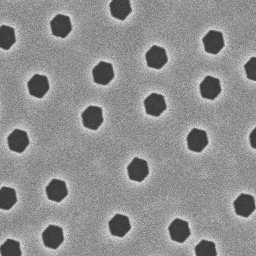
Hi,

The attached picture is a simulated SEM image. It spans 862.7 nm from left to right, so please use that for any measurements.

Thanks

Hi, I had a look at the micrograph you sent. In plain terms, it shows a regular array of holes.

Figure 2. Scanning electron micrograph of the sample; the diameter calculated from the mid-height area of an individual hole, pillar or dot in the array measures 0.0763 microns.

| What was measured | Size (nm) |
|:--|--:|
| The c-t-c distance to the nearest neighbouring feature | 159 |